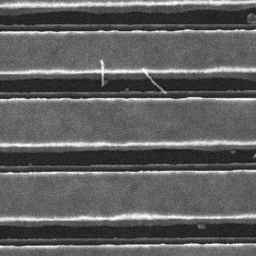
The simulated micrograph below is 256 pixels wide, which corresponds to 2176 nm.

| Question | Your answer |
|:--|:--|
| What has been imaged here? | lines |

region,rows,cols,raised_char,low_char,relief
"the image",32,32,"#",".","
###############################.
................................
................................
................................
################################
################################
################################
################################
################################
................................
................................
................................
################################
################################
################################
################################
################################
################################
................................
................................
................................
...............#.###############
################################
################################
################################
################################
################################
###############.................
................................
................................
................................
################################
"